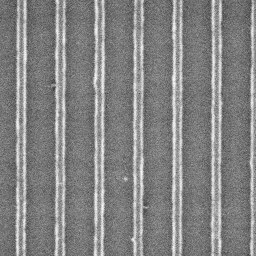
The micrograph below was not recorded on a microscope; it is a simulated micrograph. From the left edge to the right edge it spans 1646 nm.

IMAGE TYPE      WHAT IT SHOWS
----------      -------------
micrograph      parallel lines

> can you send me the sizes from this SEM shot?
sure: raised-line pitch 251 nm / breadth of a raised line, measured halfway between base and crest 46.6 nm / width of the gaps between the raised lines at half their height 203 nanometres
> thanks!